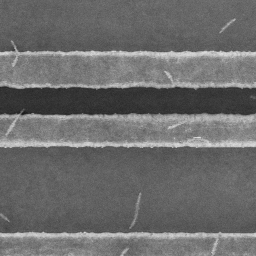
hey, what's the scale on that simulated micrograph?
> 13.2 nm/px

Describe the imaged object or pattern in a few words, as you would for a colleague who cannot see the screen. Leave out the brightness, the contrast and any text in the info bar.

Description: lines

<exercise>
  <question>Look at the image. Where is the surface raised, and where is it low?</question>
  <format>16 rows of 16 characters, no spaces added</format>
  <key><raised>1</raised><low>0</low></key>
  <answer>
0000000000000000
0000000000000000
0000000000000000
1111111111111111
1111111111111111
0100001000000000
0000000000000000
1111111111111111
1111111111111111
0000000000000000
0000000000000000
0000000000000000
0000000000000000
0000000000000000
0000000000000000
1111111111111111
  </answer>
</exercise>